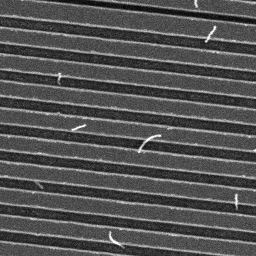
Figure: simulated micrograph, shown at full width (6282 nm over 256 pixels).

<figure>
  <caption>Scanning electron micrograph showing parallel lines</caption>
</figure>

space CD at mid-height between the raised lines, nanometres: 268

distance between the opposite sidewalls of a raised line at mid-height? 16.4 pixels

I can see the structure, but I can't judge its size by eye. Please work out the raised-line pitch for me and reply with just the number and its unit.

659 nm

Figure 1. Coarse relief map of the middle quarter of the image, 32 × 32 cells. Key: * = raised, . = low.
***********.....................
********************............
*****************************...
...*****************************
............********************
.....................***********
*****........................***
**************..................
***********************.........
********************************
......**************************
...............*****************
.......................*********
******..........................
***************.................
************************........
********************************
........************************
.................***************
....................*.....******
*********.......................
********************............
***************************.....
...*****************************
............********************
....................************
***.........................****
************....................
*********************...........
******************************..
......**************************
.............*******************